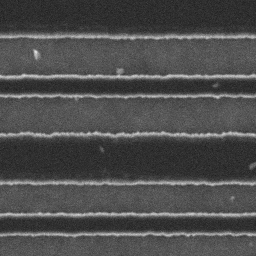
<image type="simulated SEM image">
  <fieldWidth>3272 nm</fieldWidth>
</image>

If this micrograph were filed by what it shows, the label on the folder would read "lines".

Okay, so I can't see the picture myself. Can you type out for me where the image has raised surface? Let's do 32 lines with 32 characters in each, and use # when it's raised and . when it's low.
################################
################################
################################
################################
################################
................................
................................
................................
................................
...##..###.##....#...##.######.#
################################
################################
................................
................................
................................
................................
................................
################################
################################
################################
################################
################################
################################
................................
................................
................................
................................
################################
################################
................................
................................
................................